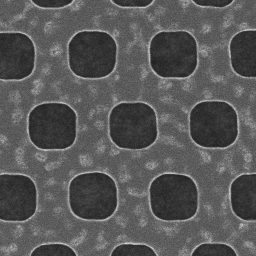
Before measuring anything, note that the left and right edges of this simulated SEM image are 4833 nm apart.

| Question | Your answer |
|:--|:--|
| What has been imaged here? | holes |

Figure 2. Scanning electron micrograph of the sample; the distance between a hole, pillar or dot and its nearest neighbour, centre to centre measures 1520 nanometers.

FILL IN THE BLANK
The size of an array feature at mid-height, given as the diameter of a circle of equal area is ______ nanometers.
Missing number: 940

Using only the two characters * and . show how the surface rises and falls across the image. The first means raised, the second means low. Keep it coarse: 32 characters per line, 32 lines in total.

****.....*****.....******....***
********************************
********************************
********************************
...******.....*****.....*****...
....*****......****......****...
....****.......****......****...
....*****......****......****...
....*****.....*****.....*****...
...*******...*******....******..
********************************
********************************
********************************
****.....*****.....*****.....***
****.....*****.....*****......**
****......****......****......**
****......****......****......**
****.....*****.....*****.....***
*****...*******...**************
********************************
********************************
********************************
....*****.....*****.....*****...
....*****......****......****...
.....****......****......****...
.....****......****......****...
....*****.....*****......****...
...********.********...********.
********************************
********************************
******..******************..****
****.....*****.....*****.....***